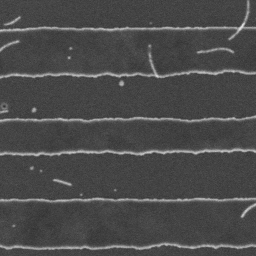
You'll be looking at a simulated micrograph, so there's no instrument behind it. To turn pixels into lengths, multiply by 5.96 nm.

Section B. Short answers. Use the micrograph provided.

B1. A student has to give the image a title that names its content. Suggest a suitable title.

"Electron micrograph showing lines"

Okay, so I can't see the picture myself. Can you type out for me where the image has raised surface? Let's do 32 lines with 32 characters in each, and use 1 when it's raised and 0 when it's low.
00000000000000000000000000000000
00000000000000000000000000000000
00000000000000000000000000000000
00001111000000000000111111111111
11111111111111111111111111111111
11111111111111111111111111111111
11111111111111111111111111111111
11111111111111111111111111111111
11111111111111111111111111111111
10011000011100100011100000000000
00000000000000000000000000000000
00000000000000000000000000000000
00000000000000000000000000000000
00000000000000000000000000000000
00000000000000000000000000000000
11111111111111111111111111111111
11111111111111111111111111111111
11111111111111111111111111111111
11111111111111111111111111111111
00000000000000000000000000000000
00000000000000000000000000000000
00000000000000000000000000000000
00000000000000000000000000000000
00000000000000000000000000000000
00000000000000000000000000000000
11111111111111111111111111111111
11111111111111111111111111111111
11111111111111111111111111111111
11111111111111111111111111111111
11111111111111111111111111111111
11111111111111111111111111111111
00000000000000000000000000000000